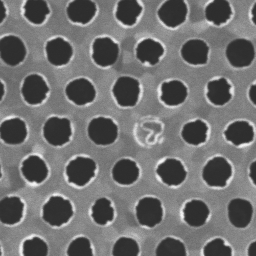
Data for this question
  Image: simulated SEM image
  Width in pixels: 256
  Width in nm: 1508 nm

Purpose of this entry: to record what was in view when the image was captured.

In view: a regular array of holes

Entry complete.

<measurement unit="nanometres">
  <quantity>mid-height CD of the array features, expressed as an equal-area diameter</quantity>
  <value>163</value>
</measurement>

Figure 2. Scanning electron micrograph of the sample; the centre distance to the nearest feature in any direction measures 264 nm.